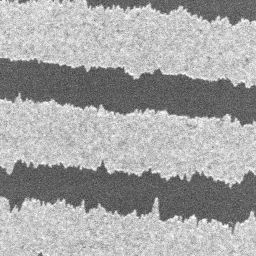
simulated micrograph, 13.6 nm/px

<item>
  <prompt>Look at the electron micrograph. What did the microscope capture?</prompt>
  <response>one or a few lines or trenches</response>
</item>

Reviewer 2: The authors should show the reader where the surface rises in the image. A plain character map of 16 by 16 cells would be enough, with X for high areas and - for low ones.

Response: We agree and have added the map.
XXXXXX----------
XXXXXXXXXXXXXXXX
XXXXXXXXXXXXXXXX
XXXXXXXXXXXXXXXX
--------X-XXXXXX
----------------
XXXX------------
XXXXXXXXXXXXXXX-
XXXXXXXXXXXXXXXX
XXXXXXXXXXXXXXXX
X----X-XXXXXXXXX
----------------
----------------
XXXXXXXXXX------
XXXXXXXXXXXXXXXX
XXXXXXXXXXXXXXXX